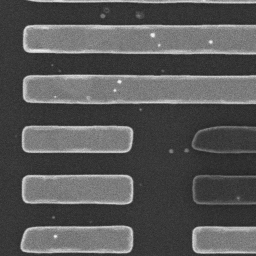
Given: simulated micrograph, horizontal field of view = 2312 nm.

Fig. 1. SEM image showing wiring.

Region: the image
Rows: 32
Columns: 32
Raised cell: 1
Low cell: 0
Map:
00000000000000000000000000000000
00000000000000000000000000000000
00000000000000000000000000000000
00011111111111111111111111111111
00011111111111111111111111111111
00011111111111111111111111111111
00000011111111111111111111111111
00000000000000000000000000000000
00000000000000000000000000000000
00011111111111111111111100000001
00011111111111111111111111111111
00011111111111111111111111111111
00011111111111111111111111111111
00000000000000000000000000000000
00000000000000000000000000000000
00000000000000000000000000000000
00011111111111111000000001111111
00011111111111111000000011111111
00011111111111110000000011111111
00000000000000000000000000000000
00000000000000000000000000000000
00000000000000000000000000000000
00011111111111111000000011111111
00011111111111111000000011111111
00011111111111111000000011111111
00000000000000110000000001111111
00000000000000000000000000000000
00000000000000000000000000000000
00001111111111110000000001111111
00011111111111111000000011111111
00011111111111111000000011111111
00001110000011110000000001111111